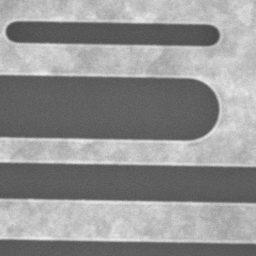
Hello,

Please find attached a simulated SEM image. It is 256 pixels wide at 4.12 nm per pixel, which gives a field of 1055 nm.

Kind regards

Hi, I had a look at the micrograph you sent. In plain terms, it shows groups of lines, slits or small figures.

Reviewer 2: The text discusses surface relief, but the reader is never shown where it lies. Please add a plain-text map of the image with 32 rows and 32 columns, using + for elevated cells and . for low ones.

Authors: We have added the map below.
++++++++++++++++++++++++++++++++
++++++++++++++++++++++++++++++++
+++.++++++++++++++++++++++++++++
+..........................+++++
+...........................++++
++.........................+++++
++++++++++++++++++++++++++++++++
++++++++++++++++++++++++++++++++
++++++++++++++++++++++++++++++++
................++++++++++++++++
..........................++++++
...........................+++++
...........................+++++
............................++++
...........................+++++
...........................+++++
..........................++++++
++++++...................+++++++
++++++++++++++++++++++++++++++++
++++++++++++++++++++++++++++++++
.........................+++++++
................................
................................
................................
................................
+++++++++++++++++++++++++++.....
++++++++++++++++++++++++++++++++
++++++++++++++++++++++++++++++++
++++++++++++++++++++++++++++++++
++++++++++++++++++++++++++++++++
................................
................................